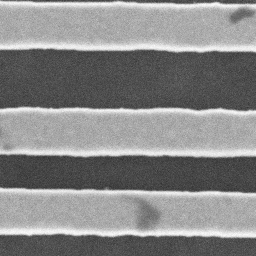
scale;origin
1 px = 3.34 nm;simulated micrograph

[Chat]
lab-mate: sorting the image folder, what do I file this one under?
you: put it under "lines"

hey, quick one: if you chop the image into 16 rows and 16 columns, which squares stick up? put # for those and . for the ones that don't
################
################
################
................
................
................
................
################
################
################
................
................
################
################
################
................